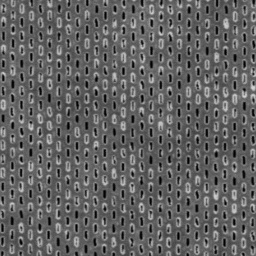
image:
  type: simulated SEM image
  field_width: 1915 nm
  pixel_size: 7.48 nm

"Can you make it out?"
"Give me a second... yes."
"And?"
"a regular array of holes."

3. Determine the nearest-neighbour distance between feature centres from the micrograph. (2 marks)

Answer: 82.9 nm